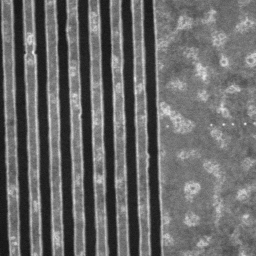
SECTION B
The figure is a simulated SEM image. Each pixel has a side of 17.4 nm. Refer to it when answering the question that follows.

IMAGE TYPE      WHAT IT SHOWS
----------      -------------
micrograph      parallel lines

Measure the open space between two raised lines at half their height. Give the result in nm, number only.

196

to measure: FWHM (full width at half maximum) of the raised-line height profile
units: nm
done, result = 196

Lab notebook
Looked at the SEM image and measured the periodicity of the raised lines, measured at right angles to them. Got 379 nm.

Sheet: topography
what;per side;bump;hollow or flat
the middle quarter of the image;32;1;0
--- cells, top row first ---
01110001100011100011000111111111
01110001100011000111000111111111
01110001100011000011000111111111
01110001100011100011000111111111
01110001100011100011000111111111
01110001100011100011000111111111
01110001100011100011000111111111
01110001100011100011000111111111
01110001100011100011000111111111
00110001110001100011100111111111
00110001110001100011000111111111
00110001110011100011000111111111
00110001110011100011100111111111
00110001110011100011100111111111
00110001110011100011000011111111
00110001110001100011100011111111
00110001110001100011100111111111
00110001110001100011100111111111
00110001110001100011100111111111
00110001110001100011100111111111
00110001110001100011100111111111
00110001110001100011100011111111
00111001110001100011100011111111
00111001110001100011100011111111
00111000110001100011100011111111
00111001110001100011100011111111
00111000110001100011100011111111
00111001110001100011100011111111
00111000110001110011100011111111
00111000110001110011100011111111
00111000110001110011100011111111
00111000110001110011100011111111